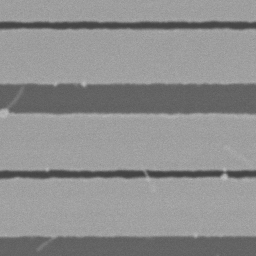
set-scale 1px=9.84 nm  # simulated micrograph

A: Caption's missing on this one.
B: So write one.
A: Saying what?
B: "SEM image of lines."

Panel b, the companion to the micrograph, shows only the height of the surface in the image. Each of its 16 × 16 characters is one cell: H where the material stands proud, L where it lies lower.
HHHHHHHHHHHHHHHH
HHHHHHHHHHHHHHHH
HHHHHHHHHHHHHHHH
HHHHHHHHHHHHHHHH
HHHHHHHHHHHHHHHH
LLLLLLLLLLLLLLLL
LLLLLLLLLLLLLLLL
HHHHHHHHHHHHHHHH
HHHHHHHHHHHHHHHH
HHHHHHHHHHHHHHHH
HHHHHHHHHHHHHHHH
HHHHHHHHHHHHHHHH
HHHHHHHHHHHHHHHH
HHHHHHHHHHHHHHHH
HHHHHHHHHHHHHHHH
LLLLLLLLLLLLLLLL